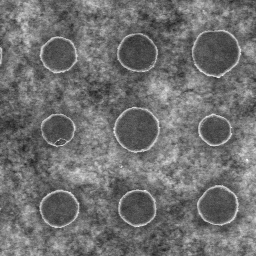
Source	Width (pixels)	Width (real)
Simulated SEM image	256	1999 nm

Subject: a regular array of raised bodies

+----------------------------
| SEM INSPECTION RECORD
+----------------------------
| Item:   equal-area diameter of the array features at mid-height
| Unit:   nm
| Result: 290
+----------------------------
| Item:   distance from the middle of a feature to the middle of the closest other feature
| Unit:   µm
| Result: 0.6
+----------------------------